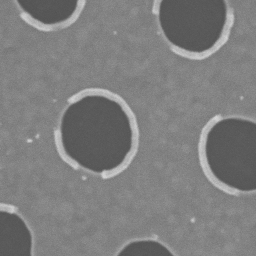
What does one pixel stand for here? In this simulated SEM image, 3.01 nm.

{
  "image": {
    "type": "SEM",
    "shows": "holes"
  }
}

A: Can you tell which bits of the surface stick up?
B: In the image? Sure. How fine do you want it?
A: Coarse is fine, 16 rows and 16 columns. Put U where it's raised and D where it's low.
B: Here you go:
UDDDDUUUUUDDDDUU
UUUUUUUUUUDDDDUU
UUUUUUUUUUUDDDUU
UUUUUUUUUUUUUUUU
UUUUUUUUUUUUUUUU
UUUUUUUUUUUUUUUU
UUUUUDDUUUUUUUUU
UUUUDDDDUUUUUUDU
UUUUDDDDUUUUUDDD
UUUUDDDDUUUUUDDD
UUUUUDDUUUUUUDDD
UUUUUUUUUUUUUUDD
UUUUUUUUUUUUUUUU
DUUUUUUUUUUUUUUU
DDUUUUUUUUUUUUUU
DDUUUUUUDDUUUUUU